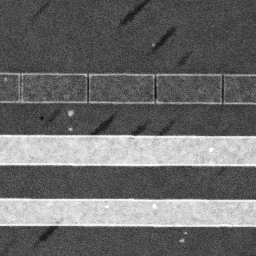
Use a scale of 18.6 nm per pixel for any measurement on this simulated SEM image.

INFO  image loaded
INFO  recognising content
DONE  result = wiring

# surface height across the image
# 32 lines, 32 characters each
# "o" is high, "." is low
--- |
................................
................................
................................
................................
................................
................................
................................
................................
................................
ooooooooooooooooooo.ooooooo.oooo
oooooooooooooooooooooooooooooooo
oooooooooooooooooooooooooooooooo
oooooooooooooooooooooooooooooooo
................................
................................
................................
................................
oooooooooooooooooooooooooooooooo
oooooooooooooooooooooooooooooooo
oooooooooooooooooooooooooooooooo
oooooooooooooooooooooooooooooooo
................................
................................
................................
................................
oooooooooooooooooooooooooooooooo
oooooooooooooooooooooooooooooooo
oooooooooooooooooooooooooooooooo
................................
................................
................................
................................